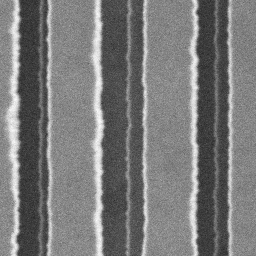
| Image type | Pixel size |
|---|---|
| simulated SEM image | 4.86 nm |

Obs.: lines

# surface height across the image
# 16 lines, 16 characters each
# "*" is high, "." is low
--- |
*..***...***..**
*..***...***..**
*..***...***..**
*..***...***..**
*..***...***..**
*..***...***..**
*..***...***..**
*..***...***..**
*..***...***..**
*..***...***..**
*..***...***..**
*..***...***..**
*..***...***..**
*..***...***..**
*..***...***..**
*..***...***..**